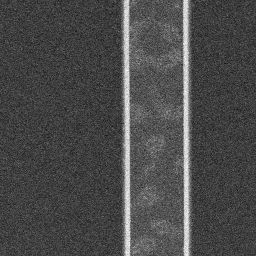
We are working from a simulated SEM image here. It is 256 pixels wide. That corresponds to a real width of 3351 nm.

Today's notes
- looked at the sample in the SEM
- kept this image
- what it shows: one or a few lines or trenches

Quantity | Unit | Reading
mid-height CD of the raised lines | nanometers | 768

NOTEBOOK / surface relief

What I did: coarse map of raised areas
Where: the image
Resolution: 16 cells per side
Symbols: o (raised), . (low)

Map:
........oooo....
........oooo....
........oooo....
........oooo....
........oooo....
........oooo....
........oooo....
........oooo....
........oooo....
........oooo....
........oooo....
........oooo....
........oooo....
........oooo....
........oooo....
........oooo....